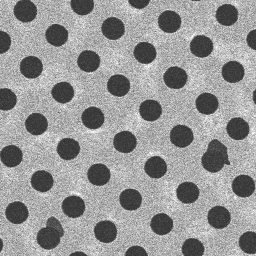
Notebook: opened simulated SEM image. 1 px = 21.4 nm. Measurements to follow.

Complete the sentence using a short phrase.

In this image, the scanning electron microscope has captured a regular array of holes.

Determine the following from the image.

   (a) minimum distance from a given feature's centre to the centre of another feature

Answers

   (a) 39.7 px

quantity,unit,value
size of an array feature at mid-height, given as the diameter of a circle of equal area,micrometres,0.494